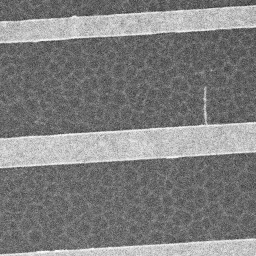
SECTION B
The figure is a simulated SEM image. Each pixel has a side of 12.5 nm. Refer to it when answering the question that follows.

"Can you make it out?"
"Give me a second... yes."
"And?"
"one or a few lines or trenches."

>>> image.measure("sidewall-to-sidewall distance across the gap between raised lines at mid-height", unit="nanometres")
1090